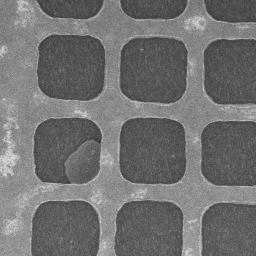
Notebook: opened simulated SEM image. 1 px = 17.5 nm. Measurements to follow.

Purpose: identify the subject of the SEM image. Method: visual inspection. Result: holes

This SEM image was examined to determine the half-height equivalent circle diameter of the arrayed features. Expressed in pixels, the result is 72.3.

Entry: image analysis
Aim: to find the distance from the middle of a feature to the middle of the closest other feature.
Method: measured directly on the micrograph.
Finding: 1430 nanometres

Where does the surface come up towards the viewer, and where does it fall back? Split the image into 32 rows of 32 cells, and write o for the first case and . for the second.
ooooo........oo........ooo......
oooooo......ooo........ooo......
ooooooooooooooooooo.ooooooo.....
oooooooooooooooooooooooooooooooo
oooooo.....ooooooooo.ooooooooooo
ooooo........ooo.......ooo......
ooooo........oo........oo.......
ooooo........oo.........o.......
ooooo........oo........oo.......
ooooo........oo........oo.......
ooooo........oo........oo.......
ooooo........oo........ooo......
ooooooooo...oooo......oooo......
oooooooooooooooooooooooooooooooo
oooooooooooooooooooooooooooooooo
ooooo.......ooo........ooo......
oooo.........oo........oo.......
oooo.........oo........oo.......
oooo.........oo........oo.......
oooo.........oo........oo.......
oooo........ooo........oo.......
oooo........ooo........oo.......
ooooo.......oooo.......ooo......
oooooooooooooooooooooooooooooooo
oooooooooooooooooooooooooooooooo
ooooo......ooooo......ooooo.....
oooo........ooo........ooo......
oooo........oo.........oo.......
oooo.........o.........oo.......
oooo.........o.........oo.......
oooo........oo.........oo.......
oooo........oo.........oo.......